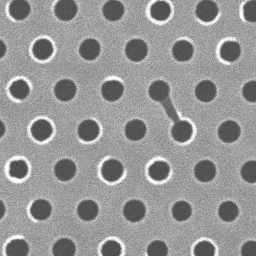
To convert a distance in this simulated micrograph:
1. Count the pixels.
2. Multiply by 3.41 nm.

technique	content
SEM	a regular array of holes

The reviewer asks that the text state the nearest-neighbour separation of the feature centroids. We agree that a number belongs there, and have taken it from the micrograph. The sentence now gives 157 nm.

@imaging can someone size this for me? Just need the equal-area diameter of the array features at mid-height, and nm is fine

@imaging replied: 74.3